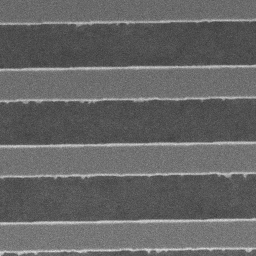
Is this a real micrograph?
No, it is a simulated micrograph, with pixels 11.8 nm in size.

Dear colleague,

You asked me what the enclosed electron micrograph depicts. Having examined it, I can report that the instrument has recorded lines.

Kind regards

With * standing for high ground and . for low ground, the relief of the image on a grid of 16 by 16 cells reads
****************
***.............
................
................
****************
****************
................
................
................
****************
****************
................
................
................
****************
****************